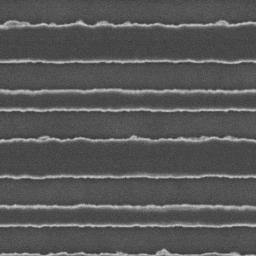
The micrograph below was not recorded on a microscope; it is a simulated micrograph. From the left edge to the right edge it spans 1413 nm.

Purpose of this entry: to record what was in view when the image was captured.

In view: lines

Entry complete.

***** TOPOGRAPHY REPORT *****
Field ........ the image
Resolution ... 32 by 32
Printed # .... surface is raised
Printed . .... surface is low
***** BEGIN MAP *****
................................
................................
................................
.###############################
.###############################
################################
################################
################################
................................
................................
................................
################################
################################
################################
................................
................................
................................
################################
################################
################################
################################
################################
................................
................................
................................
................................
################################
################################
................................
................................
................................
................................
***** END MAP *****